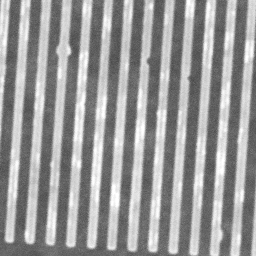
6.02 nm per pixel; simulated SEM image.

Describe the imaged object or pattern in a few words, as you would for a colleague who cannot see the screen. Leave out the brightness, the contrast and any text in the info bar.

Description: parallel lines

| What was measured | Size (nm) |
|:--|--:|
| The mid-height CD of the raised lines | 48.1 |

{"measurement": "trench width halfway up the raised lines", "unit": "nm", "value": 75.1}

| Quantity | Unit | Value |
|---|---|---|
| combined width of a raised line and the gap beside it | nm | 124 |